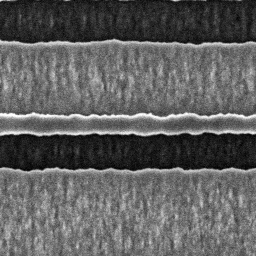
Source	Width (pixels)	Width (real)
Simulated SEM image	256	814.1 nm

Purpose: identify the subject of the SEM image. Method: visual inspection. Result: lines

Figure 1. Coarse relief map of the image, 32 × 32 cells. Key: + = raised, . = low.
................................
................................
................................
................................
................................
++++++++++++++++++++++++.+++++++
++++++++++++++++++++++++++++++++
++++++++++++++++++++++++++++++++
++++++++++++++++++++++++++++++++
++++++++++++++++++++++++++++++++
++++++++++++++++++++++++++++++++
++++++++++++++++++++++++++++++++
++++++++++++++++++++++++++++++++
++++++++++++++++++++++++++++++++
++++++++++++++++++++++++++++++++
++++++++++++++++++++++++++++++++
++++++++++++++++++++++++++++++++
................................
................................
................................
................................
++++++++++++++++++++++++++++++++
++++++++++++++++++++++++++++++++
++++++++++++++++++++++++++++++++
++++++++++++++++++++++++++++++++
++++++++++++++++++++++++++++++++
++++++++++++++++++++++++++++++++
++++++++++++++++++++++++++++++++
++++++++++++++++++++++++++++++++
++++++++++++++++++++++++++++++++
++++++++++++++++++++++++++++++++
++++++++++++++++++++++++++++++++